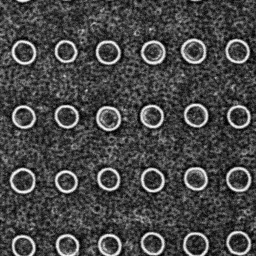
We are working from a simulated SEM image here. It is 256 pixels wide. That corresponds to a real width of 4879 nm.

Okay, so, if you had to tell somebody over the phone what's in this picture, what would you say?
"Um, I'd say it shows a regular array of raised bodies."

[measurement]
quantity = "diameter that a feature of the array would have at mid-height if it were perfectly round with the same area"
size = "413 nanometers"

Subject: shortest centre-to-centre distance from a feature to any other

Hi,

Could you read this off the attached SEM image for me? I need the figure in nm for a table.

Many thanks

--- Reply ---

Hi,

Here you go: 812